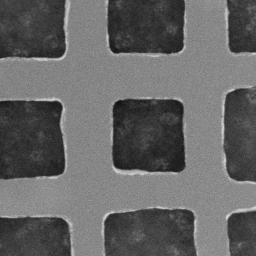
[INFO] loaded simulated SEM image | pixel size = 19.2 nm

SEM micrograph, holes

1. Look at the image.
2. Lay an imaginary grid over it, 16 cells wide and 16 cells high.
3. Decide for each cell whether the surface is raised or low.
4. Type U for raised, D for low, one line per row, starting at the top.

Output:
DDDDUUUDDDDDUUDD
DDDDUUUDDDDUUUDD
DDDDUUUDDDDUUUDD
DDDDUUUUUUUUUUUU
UUUUUUUUUUUUUUUU
UUUUUUUUUUUUUUUD
DDDDUUUDDDDUUUDD
DDDDUUUDDDDDUUDD
DDDDUUUDDDDDUUDD
DDDDUUUDDDDDUUDD
DDDDUUUDDDDUUUDD
UUUUUUUUUUUUUUUU
UUUUUUUUUUUUUUUU
UUUUUUUDDDDDUUDD
DDDDUUDDDDDDUUDD
DDDDUUDDDDDDUUDD